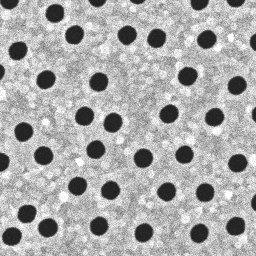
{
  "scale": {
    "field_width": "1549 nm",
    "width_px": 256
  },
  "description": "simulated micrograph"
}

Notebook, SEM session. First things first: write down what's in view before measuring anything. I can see a regular array of holes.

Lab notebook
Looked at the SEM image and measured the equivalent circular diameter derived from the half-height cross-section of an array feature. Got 115 nm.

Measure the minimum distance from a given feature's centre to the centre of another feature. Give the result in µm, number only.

0.225